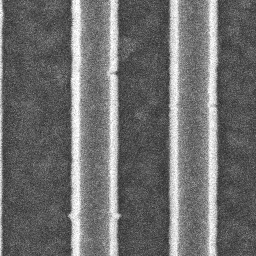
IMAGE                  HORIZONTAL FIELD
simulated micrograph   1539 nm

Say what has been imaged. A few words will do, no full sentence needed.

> one or a few lines or trenches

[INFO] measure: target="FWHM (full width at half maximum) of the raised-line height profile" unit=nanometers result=237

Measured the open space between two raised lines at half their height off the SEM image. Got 0.355 µm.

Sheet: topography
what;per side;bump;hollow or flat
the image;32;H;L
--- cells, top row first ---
LLLLLLLLLHHHHHLLLLLLLLHHHHHLLLLL
LLLLLLLLLLHHHHLLLLLLLLHHHHHLLLLL
LLLLLLLLLLHHHHLLLLLLLLHHHHHLLLLL
LLLLLLLLLLHHHHLLLLLLLLHHHHHLLLLL
LLLLLLLLLHHHHHLLLLLLLLHHHHHLLLLL
LLLLLLLLLLHHHHLLLLLLLLHHHHHLLLLL
LLLLLLLLLLHHHHLLLLLLLLHHHHHLLLLL
LLLLLLLLLLHHHHLLLLLLLLHHHHHLLLLL
LLLLLLLLLHHHHHLLLLLLLLHHHHHLLLLL
LLLLLLLLLHHHHHLLLLLLLLHHHHHLLLLL
LLLLLLLLLHHHHHLLLLLLLLHHHHHLLLLL
LLLLLLLLLHHHHHLLLLLLLLHHHHHLLLLL
LLLLLLLLLHHHHHLLLLLLLLHHHHHLLLLL
LLLLLLLLLHHHHHLLLLLLLLHHHHHLLLLL
LLLLLLLLLHHHHHLLLLLLLLHHHHHLLLLL
LLLLLLLLLHHHHHLLLLLLLLHHHHHLLLLL
LLLLLLLLLHHHHHLLLLLLLLHHHHHLLLLL
LLLLLLLLLHHHHHLLLLLLLLHHHHHLLLLL
LLLLLLLLLHHHHHLLLLLLLLHHHHHLLLLL
LLLLLLLLLHHHHHLLLLLLLLHHHHHLLLLL
LLLLLLLLLHHHHHLLLLLLLLHHHHHLLLLL
LLLLLLLLLHHHHHLLLLLLLLHHHHHLLLLL
LLLLLLLLLHHHHHLLLLLLLLHHHHHLLLLL
LLLLLLLLLHHHHHLLLLLLLLHHHHHLLLLL
LLLLLLLLLHHHHHLLLLLLLLHHHHHLLLLL
LLLLLLLLLHHHHHLLLLLLLLHHHHHLLLLL
LLLLLLLLLHHHHHLLLLLLLLHHHHHLLLLL
LLLLLLLLLHHHHHLLLLLLLLHHHHHLLLLL
LLLLLLLLLHHHHHLLLLLLLLHHHHHLLLLL
LLLLLLLLLHHHHHLLLLLLLLHHHHHLLLLL
LLLLLLLLLHHHHHLLLLLLLLHHHHHLLLLL
LLLLLLLLLHHHHHLLLLLLLLHHHHHLLLLL